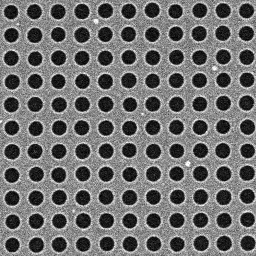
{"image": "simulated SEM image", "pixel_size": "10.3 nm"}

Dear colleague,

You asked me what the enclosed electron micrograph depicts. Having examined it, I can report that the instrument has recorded a regular array of holes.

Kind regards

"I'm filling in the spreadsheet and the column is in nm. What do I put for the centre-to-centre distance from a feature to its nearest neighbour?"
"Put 237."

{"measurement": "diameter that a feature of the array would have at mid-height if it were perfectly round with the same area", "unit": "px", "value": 15.1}